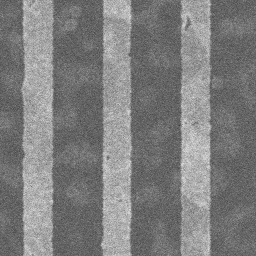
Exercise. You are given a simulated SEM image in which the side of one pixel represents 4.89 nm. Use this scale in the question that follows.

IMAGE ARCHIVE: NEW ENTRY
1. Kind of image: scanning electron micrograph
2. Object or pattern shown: one or a few lines or trenches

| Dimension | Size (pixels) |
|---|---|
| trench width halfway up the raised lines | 51.7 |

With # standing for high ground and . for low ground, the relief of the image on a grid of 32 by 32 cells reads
...####......###.......###......
...####..#...###.......###......
...####......###........##......
...####.#....###........##......
...####......###.......###......
...####......###.......###......
...####......###.......###......
...####......###.......###......
...####......###.......###......
...####......###.......###......
...####......###.......#####....
...####......###.......###......
...####......###.......###......
...###.......###.......###......
...####......###.......###......
...####......###.......#.#......
...####......###.......###......
...####......###.......###......
...####......###.......###......
...####......###.......###......
...####......###.......###......
...###.......###.......###......
...####......###.......###......
...####......###.......###......
...####......###.......###......
...####......###.......###......
...###.......###.......###......
...####......###.......###......
...####......###.......###......
...###.......###.......###......
...###.......###.......###......
...###.......###.......###......